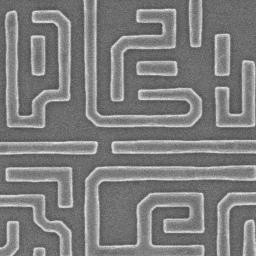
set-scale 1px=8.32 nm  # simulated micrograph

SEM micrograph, wiring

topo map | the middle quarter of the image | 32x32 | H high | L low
HLLLLHHHLLLLHHLLLLHHHHHHHHHHLLLL
HLLLLHHHLLLLHHLLLLHHHHHHHHHHLLLL
HLLLLHHHLLLLHHLLLLLHHHHHHHHHLLLL
HLLLLHHHLLLLHHHLLLLLLLLLLLLLLLLL
HLLLLHHHLLLLHHHLLLLLLLLLLLLLLLLL
HLLLLLHHLLLLHHHLLLLLLLLLLLLLLLLL
HLLLLLHHLLLLHHHLLLLLLLLLLHHHHHHH
HLLLLLHHLLLLHHHLLLLHHHHHHHHHHHHH
HLLLLLHHLLLLHHHLLLLHHHHHHHHHHHHH
LLLLLLHHLLLLLLLLLLLLLLLLLLLLLLLH
LLLLLLHHLLLLLLLLLLLLLLLLLLLLLLLL
LLLLLLHHLLLLLLLLLLLLLLLLLLLLLLLL
LLLLLLHHHLLLLLLLLLLLLLLLLLLLLLLH
LLLLLLHHHHHHHHHHHHHHHHHHHHHHHHHH
LLLLLLLHHHHHHHHHHHHHHHHHHHHHHHHH
LLLLLLLLLLLLLLLLLLLLLLLLLLLLLLLL
LLLLLLLLLLLLLLLLLLLLLLLLLLLLLLLL
LLLLLLLLLLLLLLLLLLLLLLLLLLLLLLLL
LLLLLLLLLLLLLLLLLLLLLLLLLLLLLLLL
LLHHHLHHLLLLLLLHHHHHHHHHHHHHHHHH
HHHHHHHHLLLLHHHHHHHHHHHHHHHHHHHH
HHHHHHHHLLLLHHHHHHHHHHHHHHHHHHHH
LLLLLLLLLLLLLLLLLLLLLLLLLLLLLLLL
LLLLLLLLLLLLLLLLLLLLLLLLLLLLLLLL
LLLLLLLLLLLLLLLLLLLLLLLLLLLLLLLL
LLLLLLLLLLLLLLLLLLLLLLLLLLLLLLLL
HHLLLLLLHHHHHHHHHHHHHHHHHHHHHHHH
HHLLLLLHHHHHHHHHHHHHHHHHHHHHHHHH
HHLLLLHHHHHHHHHHHHHHHHHHHHHHHHHH
HHLLLHHHHLLLLLLLLLLLLLLLLLLLLLLL
HHLLLHHHLLLLLLLLLLLLLLLLLLLLLLLL
HHLLLHHHLLLLLLLLLLLLLLLLLLLLLLLL